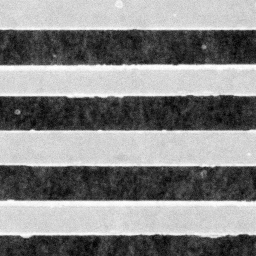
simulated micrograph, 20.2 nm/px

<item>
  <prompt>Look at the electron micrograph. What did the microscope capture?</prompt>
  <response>lines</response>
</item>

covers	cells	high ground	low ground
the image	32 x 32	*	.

********************************
********************************
********************************
********************************
................................
................................
................................
................................
.*******************************
********************************
********************************
********************************
................................
................................
................................
................................
********************************
********************************
********************************
********************************
********************************
................................
................................
................................
................................
********************************
********************************
********************************
********************************
................................
................................
................................